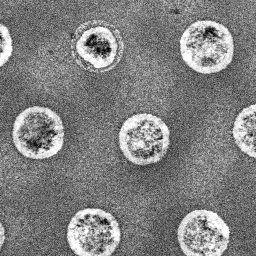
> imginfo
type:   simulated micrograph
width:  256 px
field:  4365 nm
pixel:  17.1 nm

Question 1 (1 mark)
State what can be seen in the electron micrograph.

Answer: raised bodies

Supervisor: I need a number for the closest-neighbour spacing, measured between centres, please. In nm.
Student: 1770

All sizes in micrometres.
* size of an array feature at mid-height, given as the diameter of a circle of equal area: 0.786